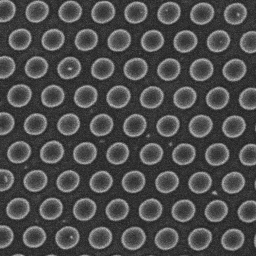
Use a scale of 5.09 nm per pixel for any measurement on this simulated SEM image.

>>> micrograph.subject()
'a regular array of raised bodies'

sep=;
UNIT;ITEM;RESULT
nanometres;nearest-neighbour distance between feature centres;165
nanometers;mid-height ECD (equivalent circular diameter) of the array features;109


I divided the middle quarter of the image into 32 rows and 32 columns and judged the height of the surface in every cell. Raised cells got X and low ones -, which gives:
XXXX---XXXXX---XXXXXX---XXXXX---
XXXX---XXXXX---XXXXXX---XXXXX---
XXX----XXXXX---XXXXX----XXXXX---
X-------XXX-----XXX-----XXXX----
--------------------------------
--------------------------------
---XXXXX----XXXX----XXXX-----XXX
---XXXXX---XXXXX----XXXXX---XXXX
---XXXXX---XXXXX---XXXXXX---XXXX
---XXXXX---XXXXX---XXXXX----XXXX
----XX------XXX-----XXX-----XXXX
--------------------------------
--------------------------------
XXX-----XXXX----XXXX-----XXX----
XXXX---XXXXX---XXXXX----XXXXX---
XXXX---XXXXX---XXXXX---XXXXXX---
XXX----XXXXX---XXXXX---XXXXX----
XX------XXX-----XXX-----XXX-----
--------------------------------
--------------------------------
---XXXX-----XXX-----XXXX-----XXX
---XXXXX---XXXXX----XXXX----XXXX
---XXXXX---XXXXX---XXXXX---XXXXX
---XXXXX---XXXXX---XXXXX---XXXXX
----XXX-----XXX-----XXX-----XXXX
--------------------------------
--------------------------------
XXX-----XXX-----XXX-----XXXX----
XXXX---XXXXX---XXXXX---XXXXX----
XXX----XXXXX---XXXXX---XXXXX---X
XXX----XXXXX---XXXXX---XXXXX---X
XX-----XXXX-----XXX-----XXX-----